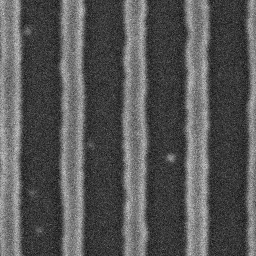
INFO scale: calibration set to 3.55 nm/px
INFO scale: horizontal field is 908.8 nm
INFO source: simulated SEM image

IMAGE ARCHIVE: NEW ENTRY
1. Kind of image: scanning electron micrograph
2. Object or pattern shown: lines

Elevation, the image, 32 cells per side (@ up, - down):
@@------@@------@@-----@@@-----@
@@------@@------@@-----@@@-----@
@@------@@------@@-----@@@-----@
@@------@@------@@------@@-----@
@@------@@------@@------@@-----@
@@------@@------@@-----@@@-----@
@@------@@------@@-----@@@-----@
@@------@@------@@-----@@@-----@
@@------@@------@@-----@@@-----@
@@------@@------@@------@@-----@
@@------@@------@@------@@-----@
@@------@@------@@-----@@@-----@
@@------@@------@@-----@@@-----@
@@------@@------@@-----@@@-----@
@@------@@------@@------@@-----@
@@------@@------@@-----@@@-----@
@@------@@------@@-----@@@-----@
@@------@@------@@------@@-----@
@@------@@------@@------@@-----@
@@------@@------@@-----@@@-----@
@@------@@------@@-----@@@-----@
@@------@@------@@-----@@@-----@
@@------@@------@@-----@@@-----@
@@------@@------@@-----@@@-----@
@@------@@------@@-----@@@-----@
@@------@@------@@-----@@@-----@
@@------@@------@@-----@@@-----@
@@------@@------@@------@@-----@
@@------@@------@@-----@@@-----@
@@------@@------@@-----@@@-----@
@@------@@------@@------@@-----@
@@------@@------@@-----@@@-----@